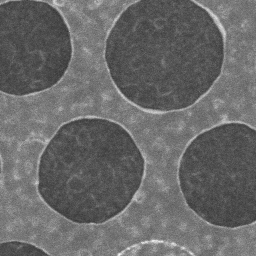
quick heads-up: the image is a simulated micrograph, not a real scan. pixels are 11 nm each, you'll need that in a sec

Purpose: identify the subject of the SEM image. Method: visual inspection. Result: holes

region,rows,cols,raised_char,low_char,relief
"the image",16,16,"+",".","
...+++++.....+++
....+++.......++
....+++.......++
....+++.......++
....+++.......++
...++++......+++
++++++++....++++
+++++..+++++++++
+++.....++++....
+++......+++....
++.......++.....
++.......++.....
+++.....++++....
++++...+++++....
++++++++++++++++
..++++++++++++++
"